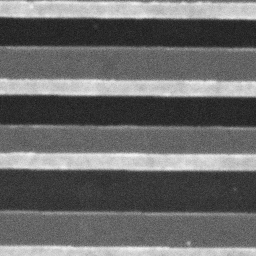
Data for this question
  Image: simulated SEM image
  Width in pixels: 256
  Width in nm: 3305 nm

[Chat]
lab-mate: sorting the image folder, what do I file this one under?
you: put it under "lines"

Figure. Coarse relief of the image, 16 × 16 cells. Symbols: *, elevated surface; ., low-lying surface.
****************
................
................
****************
****************
****************
................
................
****************
****************
****************
................
................
****************
****************
****************